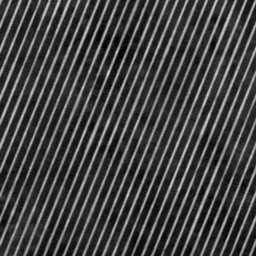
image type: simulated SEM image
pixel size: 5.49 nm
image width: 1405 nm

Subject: parallel lines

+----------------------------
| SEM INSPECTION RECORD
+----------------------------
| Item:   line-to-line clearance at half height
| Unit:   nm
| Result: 40.1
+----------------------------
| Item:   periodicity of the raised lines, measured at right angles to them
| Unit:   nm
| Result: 49.9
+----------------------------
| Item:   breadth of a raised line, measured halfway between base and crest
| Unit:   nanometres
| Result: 10.2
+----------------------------